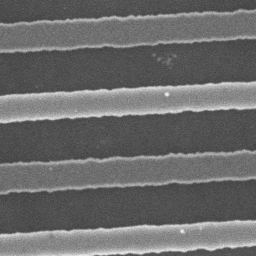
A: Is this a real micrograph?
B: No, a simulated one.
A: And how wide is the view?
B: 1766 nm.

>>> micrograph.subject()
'lines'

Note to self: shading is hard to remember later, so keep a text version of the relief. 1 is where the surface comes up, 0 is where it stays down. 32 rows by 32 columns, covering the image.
00000000000000000000000000000000
00000000000000000000000000000111
00000000111111111111111111111111
11111111111111111111111111111111
11111111111111111111111111111111
11111111111111111111000000000000
11000000000000000000000000000000
00000000000000000000000000000000
00000000000000000000000000000000
00000000000000000000000000000000
00000000000000000000000000111111
00000000011111111111111111111111
11111111111111111111111111111111
11111111111111111111111111111111
11111111111110100000000000000000
00000000000000000000000000000000
00000000000000000000000000000000
00000000000000000000000000000000
00000000000000000000000000000000
00000000000000000000111111111111
11111111111111111111111111111111
11111111111111111111111111111111
11111111111111111111111111111110
11111111111000000000000000000000
00000000000000000000000000000000
00000000000000000000000000000000
00000000000000000000000000000000
00000000000000000000000000000000
00000000000000011111111111111111
11111111111111111111111111111111
11111111111111111111111111111111
11111111111111111111000000000000